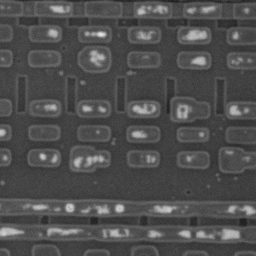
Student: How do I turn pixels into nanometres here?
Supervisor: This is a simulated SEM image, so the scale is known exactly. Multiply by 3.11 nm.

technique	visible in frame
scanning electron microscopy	wiring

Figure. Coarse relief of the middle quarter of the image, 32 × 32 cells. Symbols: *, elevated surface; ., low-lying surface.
....********....*******......***
.....******.....................
................*...............
................................
....*...........................
................................
................................
................................
...........................*****
....*******......******....*****
...********.....********...*****
...********.....********...*****
....*******.....********...*****
...........................*****
................................
................................
....*******.....********....****
....*******.....********....****
....*******.....********....****
.................******.........
................................
..******........................
..*********.....********.....***
..*********.....********....****
..*********.....********....****
..*********......******......***
..*****.........................
................................
................................
................................
................................
................................